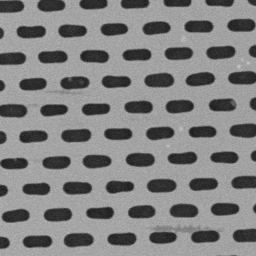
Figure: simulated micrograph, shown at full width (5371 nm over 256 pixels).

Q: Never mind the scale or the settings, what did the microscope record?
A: groups of lines, slits or small figures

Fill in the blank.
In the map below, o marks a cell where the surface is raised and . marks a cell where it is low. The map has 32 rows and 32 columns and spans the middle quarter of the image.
oooooooooooooooooooooooooooooooo
oooooooooooooooooooooooooooooooo
ooooooooooooooooooooo......ooooo
......oooo......oooo.......oooo.
......ooo........ooo.......ooo..
......oooo......ooooo......oooo.
oooooooooooooooooooooooooooooooo
oooooooooooooooooooooooooooooooo
oooooooooooooooooooooooooooooooo
oooooooooooooooo.....ooooo......
.oooo......oooo.......ooo.......
.ooo.......oooo.......oooo......
ooooo.....oooooooooooooooooooooo
oooooooooooooooooooooooooooooooo
oooooooooooooooooooooooooooooooo
oooooooooooooooooooooooooooooooo
o.....oooo.......oooo......oooo.
.......ooo.......ooo.......oooo.
.......oooo......oooo......ooooo
o....ooooooooooooooooooooooooooo
oooooooooooooooooooooooooooooooo
oooooooooooooooooooooooooooooooo
oooooooooooooooo......oooo......
.oooo......oooo........ooo......
..ooo.......ooo........ooo......
.oooo......oooooo....ooooooooooo
oooooooooooooooooooooooooooooooo
oooooooooooooooooooooooooooooooo
oooooooooooooooooooooooooooooooo
o.....ooooo......oooo.......ooo.
.......oooo.......ooo.......ooo.
.......oooo......oooo.......oooo